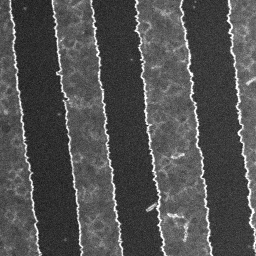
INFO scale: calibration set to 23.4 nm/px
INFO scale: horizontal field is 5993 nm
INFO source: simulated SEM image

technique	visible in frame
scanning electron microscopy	one or a few lines or trenches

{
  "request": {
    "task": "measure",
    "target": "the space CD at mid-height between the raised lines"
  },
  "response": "1010 nm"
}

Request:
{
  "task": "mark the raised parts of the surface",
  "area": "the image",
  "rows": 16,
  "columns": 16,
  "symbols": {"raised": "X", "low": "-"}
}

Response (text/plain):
X--XXX---XX---XX
X--XXX---XX---XX
X---XX---XXX---X
X---XX---XXX---X
X---XX---XXX---X
X---XX---XXX---X
X---XX---XXX---X
X---XXX--XXX---X
X---XXX--XXX---X
XX--XXX--XXXX--X
XX---XX---XXX--X
XX---XX---XXX---
XX---XX---XXX---
XX---XX---XXX---
XX---XX---XXX---
XX---XXX--XXX---